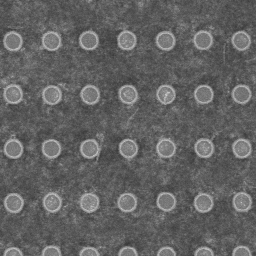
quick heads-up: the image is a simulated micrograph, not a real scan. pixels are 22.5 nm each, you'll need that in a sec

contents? a regular array of raised bodies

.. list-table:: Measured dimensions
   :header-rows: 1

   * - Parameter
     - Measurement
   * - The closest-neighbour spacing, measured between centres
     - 37.7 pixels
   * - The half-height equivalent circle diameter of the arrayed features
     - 408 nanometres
